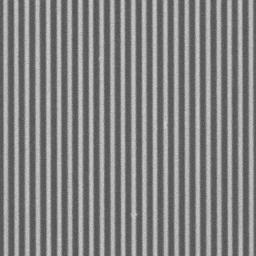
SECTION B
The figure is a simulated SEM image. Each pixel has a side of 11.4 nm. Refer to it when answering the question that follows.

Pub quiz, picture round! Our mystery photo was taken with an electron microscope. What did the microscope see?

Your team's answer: parallel lines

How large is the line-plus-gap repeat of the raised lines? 0.122 um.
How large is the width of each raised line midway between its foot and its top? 44.3 nm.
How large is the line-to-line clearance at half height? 80 nm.